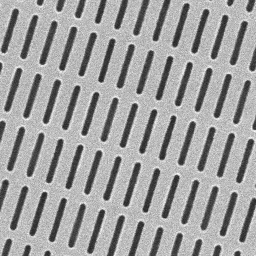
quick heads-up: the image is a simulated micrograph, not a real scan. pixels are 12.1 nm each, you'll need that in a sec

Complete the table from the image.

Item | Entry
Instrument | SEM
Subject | a regular array of holes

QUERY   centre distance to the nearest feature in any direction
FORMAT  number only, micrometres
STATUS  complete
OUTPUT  0.243